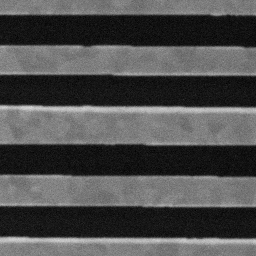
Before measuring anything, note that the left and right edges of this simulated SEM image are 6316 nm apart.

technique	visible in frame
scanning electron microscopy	lines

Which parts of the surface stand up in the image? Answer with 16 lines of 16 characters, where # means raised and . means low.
################
................
................
################
################
................
................
################
################
................
................
################
################
................
................
################